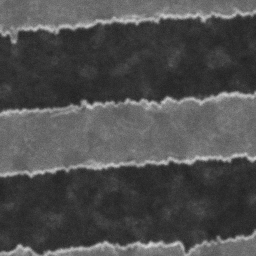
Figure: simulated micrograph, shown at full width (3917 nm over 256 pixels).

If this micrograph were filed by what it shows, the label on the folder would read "one or a few lines or trenches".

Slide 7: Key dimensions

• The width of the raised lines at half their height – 946 nm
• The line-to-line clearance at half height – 1230 nm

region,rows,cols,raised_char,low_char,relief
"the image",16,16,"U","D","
UUUUUUUUUUUUUUUU
UUUUUUDDDDDDDDDD
DDDDDDDDDDDDDDDD
DDDDDDDDDDDDDDDD
DDDDDDDDDDDDDDDD
DDDDDDDDDDDDDDDD
DDDDDUUUUUUUUUUU
UUUUUUUUUUUUUUUU
UUUUUUUUUUUUUUUU
UUUUUUUUUUUUUUUU
UUUUDDDDDDDDDDDD
DDDDDDDDDDDDDDDD
DDDDDDDDDDDDDDDD
DDDDDDDDDDDDDDDD
DDDDDDDDDDDDDDDD
DUDDDUUUUUUUUUUU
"